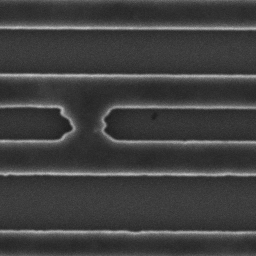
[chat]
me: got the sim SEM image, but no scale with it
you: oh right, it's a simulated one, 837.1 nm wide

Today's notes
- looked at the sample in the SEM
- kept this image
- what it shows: one or a few lines or trenches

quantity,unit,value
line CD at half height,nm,107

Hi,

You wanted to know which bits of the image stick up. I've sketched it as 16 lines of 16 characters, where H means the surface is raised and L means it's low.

HHHHHHHHHHHHHHHH
HHHHHHHHHHHHHHHH
LLLLLLLLLLLLLLLL
LLLLLLLLLLLLLLLL
LLLLLLLLLLLLLLLL
HHHHHHHHHHHHHHHH
HHHHHHHHHHHHHHHH
LLLLHHHLLLLLLLLL
LLLLHHHLLLLLLLLL
HHHHHHHHHHHHHHHH
HHHHHHHHHHHHHHHH
LLLLLLLLLLLLLLLL
LLLLLLLLLLLLLLLL
LLLLLLLLLLLLLLLL
HHHHHLHLLLLLLLLL
HHHHHHHHHHHHHHHH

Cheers